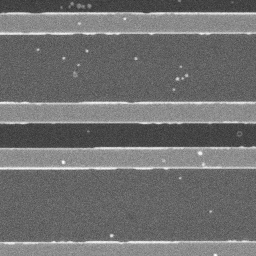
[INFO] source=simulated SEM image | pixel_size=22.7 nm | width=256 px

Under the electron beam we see lines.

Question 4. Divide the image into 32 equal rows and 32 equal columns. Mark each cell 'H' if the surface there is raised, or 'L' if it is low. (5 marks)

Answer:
LLLLLLLLLLLLLLLLLLLLLLLLLLLLLLLL
LLLLLLLLLLLLLLLLLLLLLLLLLLLLLLLL
HHHHHHHHHHHHHHHHHHHHHHHHHHHHHHHH
HHHHHHHHHHHHHHHHHHHHHHHHHHHHHHHH
LLLLLLLLLLLLLLLLLLLLLLLLLLLLLLLL
LLLLLLLLLLLLLLLLLLLLLLLLLLLLLLLL
LLLLLLLLLLLLLLLLLLLLLLLLLLLLLLLL
LLLLLLLLLLLLLLLLLLLLLLLLLLLLLLLL
LLLLLLLLLLLLLLLLLLLLLLLLLLLLLLLL
LLLLLLLLLLLLLLLLLLLLLLLLLLLLLLLL
LLLLLLLLLLLLLLLLLLLLLLLLLLLLLLLL
LLLLLLLLLLLLLLLLLLLLLLLLLLLLLLLL
LLLLLLLLLLLLLLLLLLLLLLLLLLLLLLLL
HHHHHHHHHHHHHHHHHHHHHHHHHHHHHHHH
HHHHHHHHHHHHHHHHHHHHHHHHHHHHHHHH
LLLLLLLLLLLLLLLLLLLLLLLLLLLLLLLL
LLLLLLLLLLLLLLLLLLLLLLLLLLLLLLLL
LLLLLLLLLLLLLLLLLLLLLLLLLLLLLLLL
LLLLLLLLLLLHHHHHHHHHHHHHHHHHHHHH
HHHHHHHHHHHHHHHHHHHHHHHHHHHHHHHH
HHHHHHHHHHHHHHHHHHHHHHHHHHHHHHHH
LLLLLLLLLLLLLLLLLLLLLLLLLLLLLLLL
LLLLLLLLLLLLLLLLLLLLLLLLLLLLLLLL
LLLLLLLLLLLLLLLLLLLLLLLLLLLLLLLL
LLLLLLLLLLLLLLLLLLLLLLLLLLLLLLLL
LLLLLLLLLLLLLLLLLLLLLLLLLLLLLLLL
LLLLLLLLLLLLLLLLLLLLLLLLLLLLLLLL
LLLLLLLLLLLLLLLLLLLLLLLLLLLLLLLL
LLLLLLLLLLLLLLLLLLLLLLLLLLLLLLLL
LLLLLLLLLLLLLLLLLLLLLLLLLLLLLLLL
HHHHHHHHHHHHHHHHHHHHHHHHHHHHHHHH
HHHHHHHHHHHHHHHHHHHHHHHHHHHHHHHH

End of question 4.